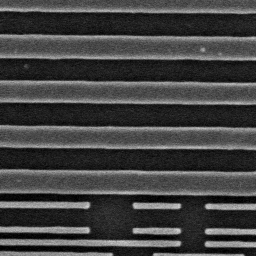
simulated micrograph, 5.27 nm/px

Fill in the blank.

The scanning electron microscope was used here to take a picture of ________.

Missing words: wiring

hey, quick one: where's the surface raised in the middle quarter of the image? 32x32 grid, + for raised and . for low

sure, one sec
................................
................................
................................
................................
++++++..........................
++++++++++++++++++++++++++++++++
++++++++++++++++++++++++++++++++
++++++++++++++++++++++++++++++++
++++++++++++++++++++++++++++++++
++++++++++++++++++++++++++++++++
................................
................................
................................
................................
................................
................................
++++++++++++++++++++++++++++++++
++++++++++++++++++++++++++++++++
++++++++++++++++++++++++++++++++
++++++++++++++++++++++++++++++++
++++++++++++++++++++++++++++++++
................................
................................
................................
................................
................................
................................
++++++++++++++++++++++++++++++++
++++++++++++++++++++++++++++++++
++++++++++++++++++++++++++++++++
++++++++++++++++++++++++++++++++
++++++++++++++++++++++++++++++++